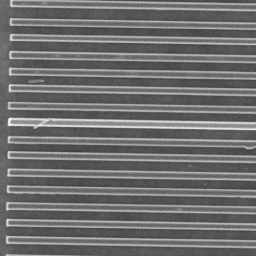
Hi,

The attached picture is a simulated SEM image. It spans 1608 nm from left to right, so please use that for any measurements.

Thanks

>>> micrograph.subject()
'parallel lines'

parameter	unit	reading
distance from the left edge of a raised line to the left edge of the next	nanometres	106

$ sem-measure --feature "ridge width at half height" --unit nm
41.6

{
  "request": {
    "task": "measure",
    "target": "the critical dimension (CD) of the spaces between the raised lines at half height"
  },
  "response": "65.9 nm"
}